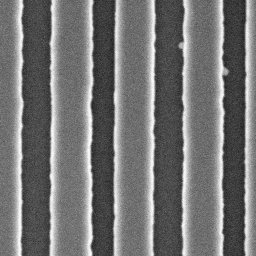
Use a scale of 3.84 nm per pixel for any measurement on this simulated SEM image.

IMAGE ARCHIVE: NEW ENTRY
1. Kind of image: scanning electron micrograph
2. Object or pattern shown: lines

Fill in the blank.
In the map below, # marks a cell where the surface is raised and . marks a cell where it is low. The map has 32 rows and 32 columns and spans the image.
###...######...####....#####...#
###...#####...#####....#####...#
###....####...#####....#####...#
###....#####..#####....#####...#
###...#####...#####....#####...#
###...######..#####....#####...#
###...#####...#####....#####...#
###...######..#####....#####...#
###...######..#####....#####...#
###...######..#####....#####...#
###...######..#####....#####...#
###...#####...#####....#####...#
###...#####...#####....#####...#
###....####...#####....#####...#
###....####...#####....#####...#
###...#####...#####....#####...#
###...#####...#####....#####...#
###...#####...#####....#####...#
###...#####...#####....#####...#
###...#####...#####....#####...#
###...#####...#####....#####...#
###...#####...#####....#####...#
###...#####...#####....#####...#
###...#####...#####....#####...#
###...#####...#####....#####...#
###...#####...#####....#####...#
###...#####...#####....#####...#
###...#####...#####....#####...#
###...#####...#####....#####...#
###...#####...#####....#####...#
##....#####...#####....#####...#
###...#####...#####....#####...#